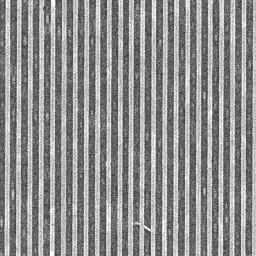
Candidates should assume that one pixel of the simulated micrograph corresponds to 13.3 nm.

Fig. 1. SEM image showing parallel lines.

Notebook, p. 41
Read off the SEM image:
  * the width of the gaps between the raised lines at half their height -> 0.0948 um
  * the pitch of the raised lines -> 150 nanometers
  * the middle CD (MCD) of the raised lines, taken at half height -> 48.2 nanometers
